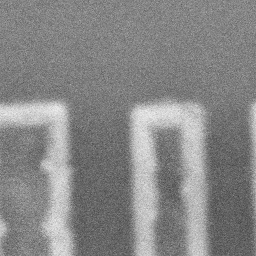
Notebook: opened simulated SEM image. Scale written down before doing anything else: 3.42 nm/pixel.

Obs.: one or a few lines or trenches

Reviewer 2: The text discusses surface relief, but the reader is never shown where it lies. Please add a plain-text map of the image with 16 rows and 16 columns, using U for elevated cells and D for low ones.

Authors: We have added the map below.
DDDDDDDDDDDDDDDD
DDDDDDDDDDDDDDDD
DDDDDDDDDDDDDDDD
DDDDDDDDDDDDDDDD
DDDDDDDDDDDDDDDD
DDDDDDDDDDDDDDDD
DDDDDDDDDDDDDDDD
UUUUDDDDDUUUDDDD
UUUUDDDDDUUUDDDD
UUUUDDDDDUUUDDDD
UUUUDDDDDUUUDDDD
UUUUDDDDDUUUDDDD
UUUUDDDDDUUUDDDD
UUUUDDDDDUUUDDDD
UUUUDDDDDUUUDDDD
UUUUDDDDDUUUDDDD